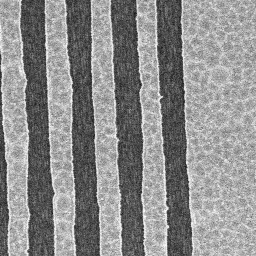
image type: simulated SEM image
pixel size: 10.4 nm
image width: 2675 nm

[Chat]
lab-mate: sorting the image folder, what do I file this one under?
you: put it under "parallel lines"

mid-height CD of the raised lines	0.213	micrometres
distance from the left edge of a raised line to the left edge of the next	0.476	µm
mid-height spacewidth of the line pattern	24.6	px